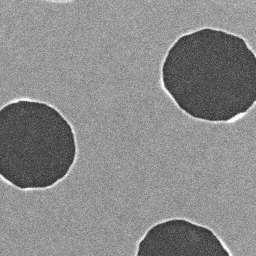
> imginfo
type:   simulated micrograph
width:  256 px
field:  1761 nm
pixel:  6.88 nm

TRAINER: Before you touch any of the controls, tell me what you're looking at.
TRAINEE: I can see holes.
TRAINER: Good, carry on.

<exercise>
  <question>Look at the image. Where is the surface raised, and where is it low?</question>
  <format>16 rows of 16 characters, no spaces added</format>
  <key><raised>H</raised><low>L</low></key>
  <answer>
HHHHHHHHHHHHHHHH
HHHHHHHHHHHHHHHH
HHHHHHHHHHHLLLLH
HHHHHHHHHHLLLLLL
HHHHHHHHHHLLLLLL
HHHHHHHHHHLLLLLL
HLLHHHHHHHHLLLLL
LLLLHHHHHHHHHLHH
LLLLLHHHHHHHHHHH
LLLLLHHHHHHHHHHH
LLLLHHHHHHHHHHHH
HLLHHHHHHHHHHHHH
HHHHHHHHHHHHHHHH
HHHHHHHHHHHHHHHH
HHHHHHHHHLLLLHHH
HHHHHHHHHLLLLLHH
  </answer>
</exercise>